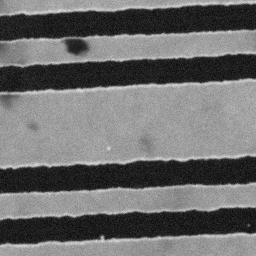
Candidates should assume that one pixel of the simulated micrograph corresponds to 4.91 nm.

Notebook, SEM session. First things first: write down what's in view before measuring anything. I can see lines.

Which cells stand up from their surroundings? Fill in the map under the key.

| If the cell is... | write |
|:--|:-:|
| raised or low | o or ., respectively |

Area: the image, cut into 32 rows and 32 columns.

oooooooooooooooooooooooooooooo..
ooooooo.........................
................................
................................
...........ooooooooooooooooooooo
oooooooooooooooooooooooooooooooo
oooooooooooooooooooooooooooooooo
oooooooooooooooo................
................................
................................
.......................ooooooooo
...ooooooooooooooooooooooooooooo
oooooooooooooooooooooooooooooooo
oooooooooooooooooooooooooooooooo
oooooooooooooooooooooooooooooooo
oooooooooooooooooooooooooooooooo
oooooooooooooooooooooooooooooooo
oooooooooooooooooooooooooooooooo
oooooooooooooooooooooooooooooooo
oooooooooooooooooooooooooooooooo
ooooooooo..o....................
................................
................................
..............oo..oooooooooooooo
oooooooooooooooooooooooooooooooo
oooooooooooooooooooooooooooooooo
oooooooooooooooo..o.............
................................
................................
........................oooooooo
....oooooooooooooooooooooooooooo
oooooooooooooooooooooooooooooooo